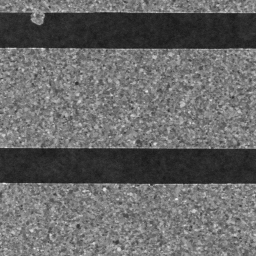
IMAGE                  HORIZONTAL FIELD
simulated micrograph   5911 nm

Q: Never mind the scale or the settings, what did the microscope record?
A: one or a few lines or trenches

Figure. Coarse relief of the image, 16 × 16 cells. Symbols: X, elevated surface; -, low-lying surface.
XXXXXXXXXXXXXXXX
----------------
----------------
XXXXXXXXXXXXXXXX
XXXXXXXXXXXXXXXX
XXXXXXXXXXXXXXXX
XXXXXXXXXXXXXXXX
XXXXXXXXXXXXXXXX
XXXXXXXXXXXXXXXX
----------------
----------------
XXX-------------
XXXXXXXXXXXXXXXX
XXXXXXXXXXXXXXXX
XXXXXXXXXXXXXXXX
XXXXXXXXXXXXXXXX